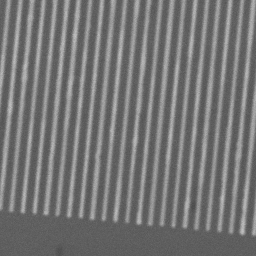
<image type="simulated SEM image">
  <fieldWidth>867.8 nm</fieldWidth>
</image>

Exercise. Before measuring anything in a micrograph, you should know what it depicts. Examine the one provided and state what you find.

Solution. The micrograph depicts parallel lines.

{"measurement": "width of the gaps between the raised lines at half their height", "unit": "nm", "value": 26.9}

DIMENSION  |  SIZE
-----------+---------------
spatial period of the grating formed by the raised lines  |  39.3 nm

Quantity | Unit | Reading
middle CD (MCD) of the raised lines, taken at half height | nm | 10.1